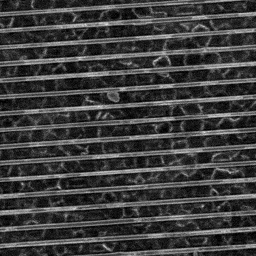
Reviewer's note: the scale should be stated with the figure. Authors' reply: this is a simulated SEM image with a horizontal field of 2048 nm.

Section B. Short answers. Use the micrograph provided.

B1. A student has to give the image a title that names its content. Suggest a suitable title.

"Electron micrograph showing parallel lines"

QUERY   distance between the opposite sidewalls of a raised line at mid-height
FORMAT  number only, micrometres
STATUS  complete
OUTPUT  0.0269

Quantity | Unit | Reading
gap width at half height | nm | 104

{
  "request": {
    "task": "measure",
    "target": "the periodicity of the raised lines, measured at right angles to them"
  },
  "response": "132 nanometres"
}